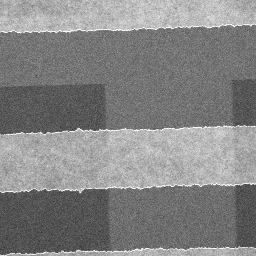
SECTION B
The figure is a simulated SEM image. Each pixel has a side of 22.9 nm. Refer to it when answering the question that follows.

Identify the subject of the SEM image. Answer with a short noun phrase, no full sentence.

one or a few lines or trenches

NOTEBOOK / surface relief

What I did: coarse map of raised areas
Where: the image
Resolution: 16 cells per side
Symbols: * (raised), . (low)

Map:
****************
****************
................
................
................
................
................
................
****************
****************
****************
***************.
................
................
................
...............*